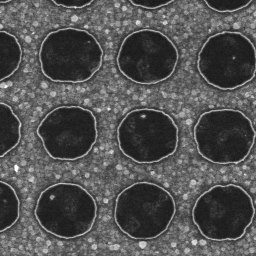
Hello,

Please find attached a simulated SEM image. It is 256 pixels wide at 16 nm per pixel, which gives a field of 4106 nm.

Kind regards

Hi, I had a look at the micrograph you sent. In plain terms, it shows raised bodies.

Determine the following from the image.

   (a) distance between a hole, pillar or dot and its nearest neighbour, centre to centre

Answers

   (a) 1240 nanometers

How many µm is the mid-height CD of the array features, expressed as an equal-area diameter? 0.92